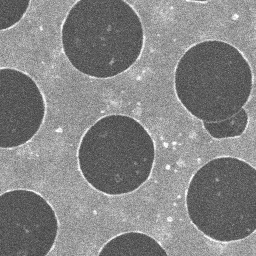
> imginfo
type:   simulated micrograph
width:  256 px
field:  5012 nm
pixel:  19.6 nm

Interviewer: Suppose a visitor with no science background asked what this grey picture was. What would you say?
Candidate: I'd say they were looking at holes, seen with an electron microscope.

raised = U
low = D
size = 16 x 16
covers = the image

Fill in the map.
DDUUUDDDUUUUUUUU
DUUUDDDDDUUUUUUU
UUUUDDDDDUUUUUUU
UUUUDDDDDUUDDDDU
DUUUUDDDUUUDDDDD
DDUUUUUUUUUDDDDD
DDDUUUUUUUUDDDDU
DDDUUUDDUUUUDDDU
DDUUUDDDDUUUUDDU
UUUUUDDDDDUUUUUU
UUUUUDDDDUUUUDDD
UUUUUUDDDUUUDDDD
DDDUUUUUUUUUDDDD
DDDUUUUUUUUUDDDD
DDDDUUUUUUUUUDDD
DDDUUUDDDDUUUUUU